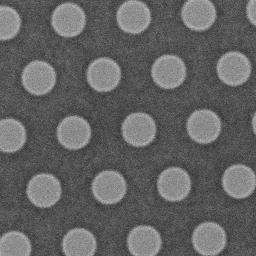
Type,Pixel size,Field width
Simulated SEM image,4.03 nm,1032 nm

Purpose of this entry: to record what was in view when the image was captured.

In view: an array of small figures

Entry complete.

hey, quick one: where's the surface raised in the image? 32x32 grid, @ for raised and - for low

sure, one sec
--------@------@@@-----@@@-----@
@@-----@@@-----@@@@----@@@@----@
@@-----@@@@----@@@@----@@@@----@
@@-----@@@-----@@@------@@------
@@------------------------------
--------------------------------
--------------------------------
------------@@------@@------@@@-
---@@@-----@@@@----@@@@----@@@@-
---@@@@----@@@@----@@@@----@@@@-
---@@@@----@@@@-----@@-------@--
----@@--------------------------
--------------------------------
--------------------------------
----------------@@------@@@-----
@@@-----@@@----@@@@-----@@@@----
@@@----@@@@----@@@@-----@@@-----
@@@----@@@@-----@@@-----@@@-----
@@-------@----------------------
--------------------------------
--------------------------------
-------------@------@@@-----@@@@
----@@@-----@@@-----@@@@----@@@@
----@@@-----@@@@----@@@@----@@@@
----@@@-----@@@-----@@@------@@-
----@@@-------------------------
--------------------------------
--------------------------------
-----------------@@------@@@----
@@@-----@@@@----@@@@----@@@@----
@@@@----@@@@----@@@@----@@@@----
@@@@----@@@@----@@@@-----@@-----